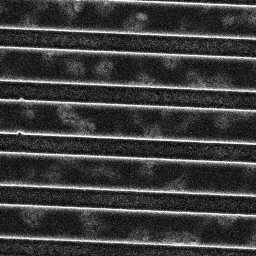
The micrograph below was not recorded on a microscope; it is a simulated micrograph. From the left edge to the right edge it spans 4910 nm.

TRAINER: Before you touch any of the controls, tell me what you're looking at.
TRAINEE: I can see parallel lines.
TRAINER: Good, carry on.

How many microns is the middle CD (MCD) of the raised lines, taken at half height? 0.63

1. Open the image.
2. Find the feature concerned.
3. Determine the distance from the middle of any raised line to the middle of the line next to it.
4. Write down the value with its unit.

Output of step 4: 1000 nm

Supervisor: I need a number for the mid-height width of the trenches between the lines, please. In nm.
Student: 359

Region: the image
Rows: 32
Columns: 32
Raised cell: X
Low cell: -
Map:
XXXXXXXXXXXXXXXXXXXXXXXXX-------
XXXXXXXXXXXXXXXXXXXXXXXXXXXXXXXX
XXXXXXXXXXXXXXXXXXXXXXXXXXXXXXXX
-XXXXXXXXXXXXXXXXXXXXXXXXXXXXXXX
------------------------XXXXXXXX
--------------------------------
XXXXXXXXXXXXXX------------------
XXXXXXXXXXXXXXXXXXXXXXXXXXXXXXXX
XXXXXXXXXXXXXXXXXXXXXXXXXXXXXXXX
XXXXXXXXXXXXXXXXXXXXXXXXXXXXXXXX
-----------XXXXXXXXXXXXXXXXXXXXX
--------------------------------
X-X-----------------------------
XXXXXXXXXXXXXXXXXXXXXXXX--------
XXXXXXXXXXXXXXXXXXXXXXXXXXXXXXXX
XXXXXXXXXXXXXXXXXXXXXXXXXXXXXXXX
XXXXXXXXXXXXXXXXXXXXXXXXXXXXXXXX
--------------------XXXXXXXXXXXX
--------------------------------
XXXXXXXXXXX---------------------
XXXXXXXXXXXXXXXXXXXXXXXXXXXXXXXX
XXXXXXXXXXXXXXXXXXXXXXXXXXXXXXXX
XXXXXXXXXXXXXXXXXXXXXXXXXXXXXXXX
----------XXXXXXXXXXXXXXXXXXXXXX
--------------------------------
--------------------------------
XXXXXXXXXXXXXXXXXXXX------------
XXXXXXXXXXXXXXXXXXXXXXXXXXXXXXXX
XXXXXXXXXXXXXXXXXXXXXXXXXXXXXXXX
XXXXXXXXXXXXXXXXXXXXXXXXXXXXXXXX
--------------------XXXXXXXXXXXX
--------------------------------